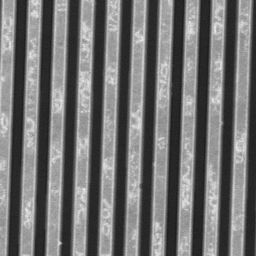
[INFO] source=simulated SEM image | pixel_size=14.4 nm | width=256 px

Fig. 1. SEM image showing parallel lines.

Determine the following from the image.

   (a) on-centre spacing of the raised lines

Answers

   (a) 379 nm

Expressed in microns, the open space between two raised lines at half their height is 0.182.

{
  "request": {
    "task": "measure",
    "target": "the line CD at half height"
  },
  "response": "14.2 pixels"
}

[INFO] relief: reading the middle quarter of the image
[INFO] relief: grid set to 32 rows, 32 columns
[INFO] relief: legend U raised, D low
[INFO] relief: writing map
DDDDUUUDDDUUUUDDDUUUDDDUUUUDDDUU
DDDDUUUDDDUUUUDDDUUUDDDUUUUDDDUU
DDDDUUUDDDUUUUDDDUUUDDDUUUUDDDUU
DDDDUUUDDDUUUDDDDUUUDDDUUUUDDDUU
DDDDUUUDDDUUUDDDDUUUDDDUUUDDDDUU
DDDDUUUDDDUUUDDDDUUUDDDUUUDDDDUU
DDDUUUUDDDUUUDDDDUUUDDDUUUDDDDUU
DDDUUUUDDDUUUDDDDUUUDDDUUUDDDDUU
DDDUUUUDDDUUUDDDUUUUDDDUUUDDDDUU
DDDUUUUDDDUUUDDDUUUUDDDUUUDDDDUU
DDDUUUUDDDUUUDDDUUUUDDDUUUDDDDUU
DDDUUUUDDDUUUDDDUUUUDDDUUUDDDDUU
DDDUUUUDDDUUUDDDUUUUDDDUUUDDDDUU
DDDUUUUDDDUUUDDDUUUUDDDUUUDDDDUU
DDDUUUUDDDUUUDDDUUUUDDDUUUDDDDUU
DDDUUUUDDDUUUDDDUUUUDDDUUUDDDDUU
DDDUUUUDDDUUUDDDUUUUDDDUUUDDDUUU
DDDUUUDDDDUUUDDDUUUUDDDUUUDDDUUU
DDDUUUDDDDUUUDDDUUUDDDDUUUDDDUUU
DDDUUUDDDDUUUDDDUUUDDDDUUUDDDUUU
DDDUUUDDDDUUUDDDUUUDDDDUUUDDDUUU
DDDUUUDDDDUUUDDDUUUDDDDUUUDDDUUU
DDDUUUDDDUUUUDDDUUUDDDDUUUDDDUUU
DDDUUUDDDUUUUDDDUUUDDDDUUUDDDUUU
DDDUUUDDDUUUUDDDUUUDDDUUUUDDDUUU
DDDUUUDDDUUUUDDDUUUDDDUUUUDDDUUU
DDDUUUDDDUUUUDDDUUUDDDDUUUDDDUUU
DDDUUUDDDUUUUDDDUUUDDDDUUUDDDUUU
DDDUUUDDDUUUUDDDUUUDDDDUUUDDDUUU
DDDUUUDDDUUUUDDDUUUDDDDUUUDDDUUU
DDDUUUDDDUUUUDDDUUUDDDUUUUDDDUUU
DDDUUUDDDUUUUDDDUUUDDDUUUUDDDUUU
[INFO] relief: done